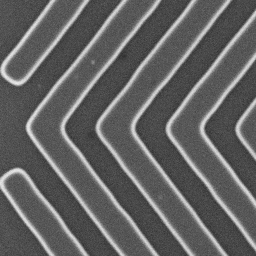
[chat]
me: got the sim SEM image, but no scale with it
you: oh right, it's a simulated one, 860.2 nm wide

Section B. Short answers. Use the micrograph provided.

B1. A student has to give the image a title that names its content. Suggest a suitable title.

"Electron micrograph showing groups of lines, slits or small figures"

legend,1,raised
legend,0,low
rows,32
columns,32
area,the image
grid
00000011111000011111000011110000
00000011110000111110000111110000
00000111100000111100001111100001
00001111000001111000011111000011
00011111000011110000011110000011
00111110000111110000111100000111
00111100000111100001111100001111
01111000001111000011111000011111
11110000011110000111110000111110
01110000111100000111100000111100
00000001111100001111100001111000
00000011111000011111000011110000
00000011110000111110000111110000
00000111100000111100000111100001
00001111100001111000001111000011
00001111000011111000011111000011
00001111000011111000011110000011
00001111100001111000001111000011
00000111100000111100001111100001
00000011110000111110000111110000
00000011111000011111000011110000
01100001111100001111000001111000
11110000111100000111100001111100
11110000011110000111110000111110
01111000001111000011111000011110
00111100001111100001111000001111
00111110000111110000111100001111
00011111000011110000011110000111
00001111000001111000011111000011
00000111100001111100001111000001
00000111110000111110000111100001
00000011111000011110000011110000